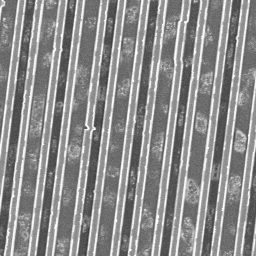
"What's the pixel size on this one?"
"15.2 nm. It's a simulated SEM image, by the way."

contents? parallel lines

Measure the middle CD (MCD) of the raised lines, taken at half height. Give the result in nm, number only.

122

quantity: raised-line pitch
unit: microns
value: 0.31